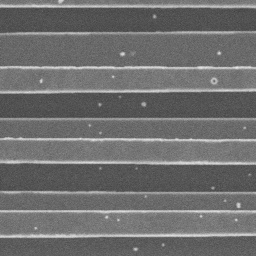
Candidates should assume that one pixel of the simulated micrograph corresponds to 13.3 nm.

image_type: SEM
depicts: lines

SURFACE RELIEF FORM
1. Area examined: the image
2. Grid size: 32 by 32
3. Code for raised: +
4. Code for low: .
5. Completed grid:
++++++++++++++++++++++++++++++++
................................
................................
................................
++++++++++++++++++++++++++++++++
++++++++++++++++++++++++++++++++
++++++++++++++++++++++++++++++++
++++++++++++++++++++++++++++++++
++++++++++++++++++++++++++++++++
++++++++++++++++++++++++++++++++
++++++++++++++++++++++++++++++++
+++++...........................
................................
................................
................................
++++++++++++++++++++++++++++++++
++++++++++++++++++++++++++++++++
++++++++++++++++++++++++++++++++
++++++++++++++++++++++++++++++++
++++++++++++++++++++++++++++++++
......................++.+++++++
................................
................................
................................
++++++++++++++++++++++++++++++++
++++++++++++++++++++++++++++++++
++++++++++++++++++++++++++++++++
++++++++++++++++++++++++++++++++
++++++++++++++++++++++++++++++++
+++++++++++++++++++++++.........
................................
................................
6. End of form